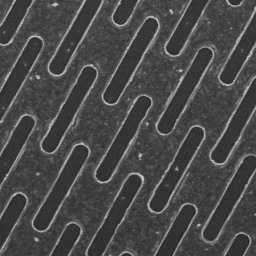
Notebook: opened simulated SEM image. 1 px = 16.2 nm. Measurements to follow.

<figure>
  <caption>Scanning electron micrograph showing holes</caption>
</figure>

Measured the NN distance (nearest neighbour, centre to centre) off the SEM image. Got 1000 nm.